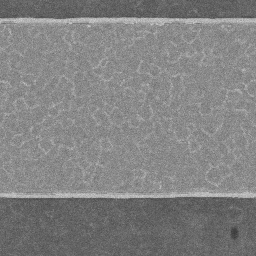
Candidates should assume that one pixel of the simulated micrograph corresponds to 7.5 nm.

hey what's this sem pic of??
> one or a few lines or trenches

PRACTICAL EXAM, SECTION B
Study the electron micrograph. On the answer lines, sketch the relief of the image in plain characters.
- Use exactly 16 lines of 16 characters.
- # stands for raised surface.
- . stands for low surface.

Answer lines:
................
################
################
################
################
################
################
################
################
################
################
################
................
................
................
................